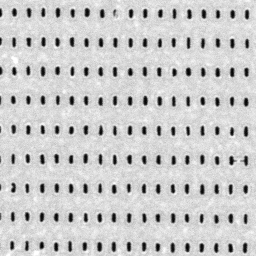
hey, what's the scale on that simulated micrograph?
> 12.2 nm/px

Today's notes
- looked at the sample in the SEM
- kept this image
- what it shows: a regular array of holes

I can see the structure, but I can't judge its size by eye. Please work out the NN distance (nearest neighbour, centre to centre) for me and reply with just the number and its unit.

0.173 um